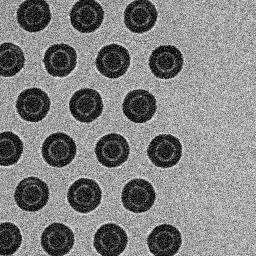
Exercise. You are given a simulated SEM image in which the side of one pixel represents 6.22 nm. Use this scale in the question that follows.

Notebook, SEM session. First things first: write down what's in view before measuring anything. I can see a regular array of ring-shaped grooves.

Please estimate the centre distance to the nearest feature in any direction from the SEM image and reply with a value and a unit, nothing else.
0.321 microns